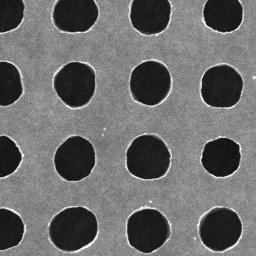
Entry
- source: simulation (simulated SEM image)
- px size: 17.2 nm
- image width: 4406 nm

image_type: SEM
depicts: a regular array of holes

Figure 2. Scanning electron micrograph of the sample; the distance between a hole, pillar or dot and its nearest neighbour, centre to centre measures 72 pixels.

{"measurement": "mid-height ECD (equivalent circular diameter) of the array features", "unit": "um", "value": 0.733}